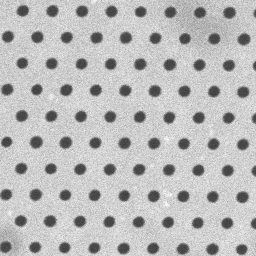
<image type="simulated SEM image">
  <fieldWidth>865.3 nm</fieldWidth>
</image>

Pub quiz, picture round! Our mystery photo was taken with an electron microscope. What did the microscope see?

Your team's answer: a regular array of holes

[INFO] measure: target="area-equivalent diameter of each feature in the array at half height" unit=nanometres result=36.9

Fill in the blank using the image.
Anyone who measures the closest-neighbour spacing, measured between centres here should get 98.9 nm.